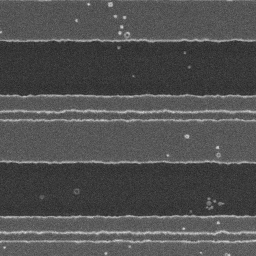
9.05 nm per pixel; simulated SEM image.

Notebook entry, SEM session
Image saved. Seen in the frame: lines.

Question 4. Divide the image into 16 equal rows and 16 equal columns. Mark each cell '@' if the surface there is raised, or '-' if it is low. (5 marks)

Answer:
@@@@@@@@@@@@@@@@
@@@@@@@@@@@@@@@@
@@@@@@@@@@@@@@@@
----------------
----------------
----------------
@@@@@@@@@@@@@@@@
@@@@@@@@@@@@@@@@
@@@@@@@@@@@@@@@@
@@@@@@@@@@@@@@@@
----------------
----------------
----------------
-----------@-@@-
@@@@@@@@@@@@@@@@
@@@@@@@@@@@@@@@@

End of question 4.